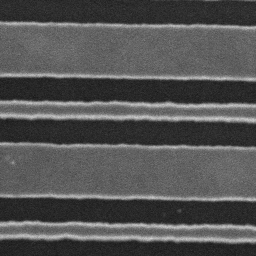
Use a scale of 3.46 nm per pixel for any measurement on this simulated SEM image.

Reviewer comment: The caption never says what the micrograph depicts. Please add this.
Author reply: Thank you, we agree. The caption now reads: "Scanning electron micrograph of lines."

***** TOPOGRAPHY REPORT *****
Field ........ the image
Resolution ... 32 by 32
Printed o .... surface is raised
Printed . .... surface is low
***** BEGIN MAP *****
................................
................................
................................
oooooooooooooooooooooooooooooooo
oooooooooooooooooooooooooooooooo
oooooooooooooooooooooooooooooooo
oooooooooooooooooooooooooooooooo
oooooooooooooooooooooooooooooooo
oooooooooooooooooooooooooooooooo
oooooooooooooooooooooooooooooooo
................................
................................
................................
oooooooooooooooooooooooooooooooo
oooooooooooooooooooooooooooooooo
................................
................................
................................
oooooooooooooooooooooooooooooooo
oooooooooooooooooooooooooooooooo
oooooooooooooooooooooooooooooooo
oooooooooooooooooooooooooooooooo
oooooooooooooooooooooooooooooooo
oooooooooooooooooooooooooooooooo
oooooooooooooooooooooooooooooooo
................................
................................
................................
oooooooooooooooooooooooooooooooo
oooooooooooooooooooooooooooooooo
................................
................................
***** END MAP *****